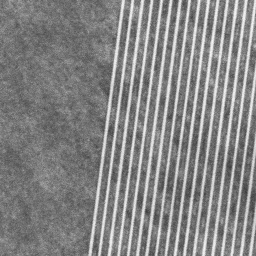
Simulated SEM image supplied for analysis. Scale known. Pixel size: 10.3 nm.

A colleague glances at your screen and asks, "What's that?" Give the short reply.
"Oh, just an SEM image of parallel lines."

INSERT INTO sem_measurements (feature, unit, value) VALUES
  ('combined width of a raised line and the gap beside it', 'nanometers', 96.3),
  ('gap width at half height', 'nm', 76.5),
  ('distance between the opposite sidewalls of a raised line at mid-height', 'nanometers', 25.5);